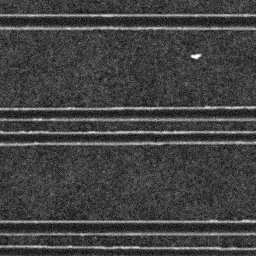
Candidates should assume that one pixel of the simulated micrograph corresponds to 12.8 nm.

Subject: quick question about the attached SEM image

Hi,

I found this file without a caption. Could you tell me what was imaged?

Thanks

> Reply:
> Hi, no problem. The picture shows lines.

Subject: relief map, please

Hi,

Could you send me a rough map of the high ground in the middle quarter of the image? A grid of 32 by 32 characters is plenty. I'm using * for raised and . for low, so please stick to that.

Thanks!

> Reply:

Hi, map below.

................................
................................
................................
................................
................................
................................
................................
................................
................................
................................
................................
********************************
********************************
********************************
................................
................................
................................
********************************
********************************
********************************
................................
................................
................................
................................
................................
................................
................................
................................
................................
................................
................................
................................